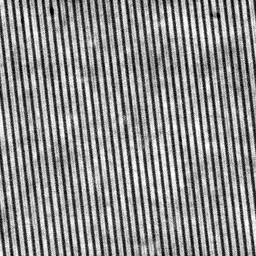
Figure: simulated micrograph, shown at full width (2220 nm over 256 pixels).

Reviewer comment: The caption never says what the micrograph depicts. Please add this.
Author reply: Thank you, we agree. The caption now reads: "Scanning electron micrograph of parallel lines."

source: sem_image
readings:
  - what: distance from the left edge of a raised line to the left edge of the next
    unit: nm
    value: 65.1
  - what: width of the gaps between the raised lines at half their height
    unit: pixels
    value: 5.34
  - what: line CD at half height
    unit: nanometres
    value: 20.4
